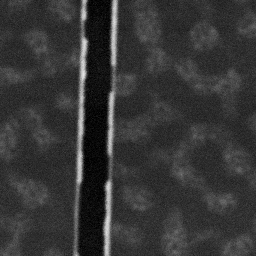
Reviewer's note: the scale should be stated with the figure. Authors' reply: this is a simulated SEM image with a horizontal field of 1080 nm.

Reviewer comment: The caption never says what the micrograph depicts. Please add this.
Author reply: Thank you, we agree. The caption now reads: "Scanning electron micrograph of one or a few lines or trenches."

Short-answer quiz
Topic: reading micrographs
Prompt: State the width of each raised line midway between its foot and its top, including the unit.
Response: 32.3 px